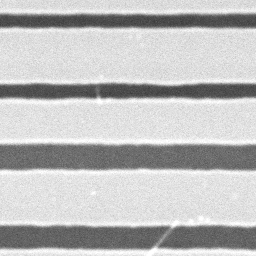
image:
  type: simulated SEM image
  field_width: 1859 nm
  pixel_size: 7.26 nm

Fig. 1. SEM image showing lines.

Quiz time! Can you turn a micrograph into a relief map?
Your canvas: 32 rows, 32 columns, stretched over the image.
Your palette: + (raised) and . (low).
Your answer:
++++++++++++++++++++++++++++++++
++++++++++++++++++++++++++++++++
................................
...........+............+.......
++++++++++++++++++++++++++++++++
++++++++++++++++++++++++++++++++
++++++++++++++++++++++++++++++++
++++++++++++++++++++++++++++++++
++++++++++++++++++++++++++++++++
++++++++++++++++++++++++++++++++
...................++++.........
................................
++++++++++++++++++++++++++++++++
++++++++++++++++++++++++++++++++
++++++++++++++++++++++++++++++++
++++++++++++++++++++++++++++++++
++++++++++++++++++++++++++++++++
++++++++++++++++++++++++++++++++
................................
................................
................................
++++++++++++++++++++++++++++++++
++++++++++++++++++++++++++++++++
++++++++++++++++++++++++++++++++
++++++++++++++++++++++++++++++++
++++++++++++++++++++++++++++++++
++++++++++++++++++++++++++++++++
++++++++++++++++++++++++++++++++
................................
................................
................................
++++++++++++++++++++++++++++++++